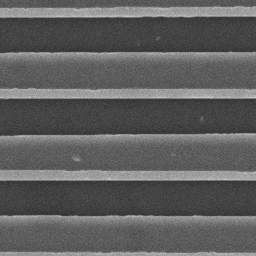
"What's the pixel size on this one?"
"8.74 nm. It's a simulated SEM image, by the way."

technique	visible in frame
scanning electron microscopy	lines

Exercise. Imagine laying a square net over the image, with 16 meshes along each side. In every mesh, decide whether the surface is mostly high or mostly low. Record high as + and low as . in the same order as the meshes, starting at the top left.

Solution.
++++++++++++++++
................
................
++++++++++++++++
++++++++++++++++
++++++++++++++++
................
................
.+++++++++++++++
++++++++++++++++
++++++++++++++++
................
................
..++....+.......
++++++++++++++++
++++++++++++++++